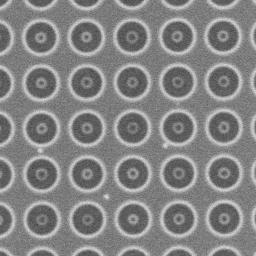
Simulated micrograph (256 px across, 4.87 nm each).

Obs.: an array of small figures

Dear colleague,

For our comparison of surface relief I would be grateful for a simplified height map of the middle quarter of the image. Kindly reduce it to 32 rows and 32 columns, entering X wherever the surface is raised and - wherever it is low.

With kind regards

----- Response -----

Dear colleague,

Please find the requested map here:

XXXXXXXXXXXXXXXX--XXXXXXXXXX-XXX
XXX-----XXXXXXX----XXXXXXX-----X
XX-------XXXXX-------XXXX-------
XX---X----XXX----X---XXXX---X---
XX---XX---XXX---XX---XXX---XXX--
XX---X----XXX---XX---XXX----X---
XX-------XXXX--------XXXX-------
XXX------XXXXX------XXXXXX-----X
XXXX---XXXXXXXXX--XXXXXXXXXX-XXX
XXXXXXXXXXXXXXXXXXXXXXXXXXXXXXXX
XXXXXXXXXXXXXXXXXXXXXXXXXXXXXXXX
XXXXXXXXXXXXXXXXXXXXXXXXXXXXXXXX
XXXX---XXXXXXXX----XXXXXXX-----X
XXX------XXXXX------XXXXX-------
XX-------XXXX--------XXXX-------
XX---XX---XXX---XX---XXX---XXX--
XX---XX---XXX---XX---XXXX---XX--
XX--------XXX--------XXXX-------
XXX------XXXXX------XXXXX-------
XXXX----XXXXXXX----XXXXXXXX---XX
XXXXXXXXXXXXXXXXXXXXXXXXXXXXXXXX
XXXXXXXXXXXXXXXXXXXXXXXXXXXXXXXX
XXXXXXXXXXXXXXXXXXXXXXXXXXXXXXXX
XXXXX-XXXXXXXXXX--XXXXXXXXX---XX
XXX-----XXXXXX------XXXXXX------
XX-------XXXXX-------XXXX-------
XX--------XXX----X---XXXX---XX--
XX---XX---XXX---XX---XXX---XXX--
XX--------XXX--------XXXX---X---
XX-------XXXXX-------XXXX-------
XXX------XXXXXX-----XXXXXX-----X
XXXXX--XXXXXXXXXXXXXXXXXXXXXXXXX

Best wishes